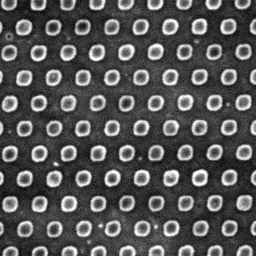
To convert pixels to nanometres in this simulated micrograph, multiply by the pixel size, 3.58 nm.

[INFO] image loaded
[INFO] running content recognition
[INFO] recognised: a regular array of raised bodies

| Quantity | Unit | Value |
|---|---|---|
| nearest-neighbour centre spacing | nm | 103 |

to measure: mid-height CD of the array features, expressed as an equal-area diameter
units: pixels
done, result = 15.2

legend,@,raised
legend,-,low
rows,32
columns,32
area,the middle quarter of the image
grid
--------------------------------
--------------------------------
---@@@@---@@@@----@@@----@@@----
---@@@----@@@@----@@@----@@@----
---@@@----@@@-----@@@----@@@----
--------------------------------
--------------------------------
--------------------------------
@@@----@@@----@@@-----@@-----@@@
@@@----@@@----@@@----@@@@----@@@
@@@----@@@----@@@----@@@@----@@@
@------@------@@------@---------
--------------------------------
--------------------------------
----@@-----@@------@@-----@@----
---@@@-----@@@----@@@----@@@----
---@@@-----@@@----@@@----@@@----
---@@@-----@@-----@@-----@@-----
--------------------------------
--------------------------------
------------------------------@-
@@@----@@@----@@@----@@@@----@@@
@@@----@@@----@@@----@@@@----@@@
@@-----@@@----@@@----@@@-----@@-
--------------------------------
--------------------------------
--------------------------------
---@@@-----@@@----@@@----@@@----
---@@@@---@@@@----@@@----@@@----
---@@@----@@@@----@@@----@@@----
--------------------------------
--------------------------------